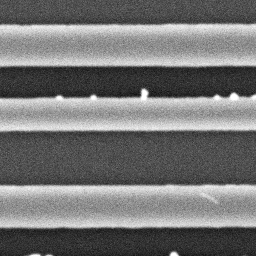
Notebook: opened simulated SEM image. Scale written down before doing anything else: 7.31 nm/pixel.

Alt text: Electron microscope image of lines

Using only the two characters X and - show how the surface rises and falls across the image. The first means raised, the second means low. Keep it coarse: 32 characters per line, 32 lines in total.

--------------------------------
--------------------------------
--------------------------------
XXXXXXXXXXXXXXXXXXXXXXXXXXXXXXXX
XXXXXXXXXXXXXXXXXXXXXXXXXXXXXXXX
XXXXXXXXXXXXXXXXXXXXXXXXXXXXXXXX
XXXXXXXXXXXXXXXXXXXXXXXXXXXXXXXX
XXXXXXXXXXXXXXXXXXXXXXXXXXXXXXXX
--------------------------------
--------------------------------
--------------------------------
--------------------------------
XXXXXXXXXXXXXXXXXXXXXXXXXXXXXXXX
XXXXXXXXXXXXXXXXXXXXXXXXXXXXXXXX
XXXXXXXXXXXXXXXXXXXXXXXXXXXXXXXX
XXXXXXXXXXXXXXXXXXXXXXXXXXXXXXXX
--------------------------------
--------------------------------
--------------------------------
--------------------------------
--------------------------------
--------------------------------
--------------------------------
XXXXXXXXXXXXXXXXXXXXXXXXXXXXXXXX
XXXXXXXXXXXXXXXXXXXXXXXXXXXXXXXX
XXXXXXXXXXXXXXXXXXXXXXXXXXXXXXXX
XXXXXXXXXXXXXXXXXXXXXXXXXXXXXXXX
XXXXXXXXXXXXXXXXXXXXXXXXXXXXXXXX
--------------------------------
--------------------------------
--------------------------------
--------------------------------